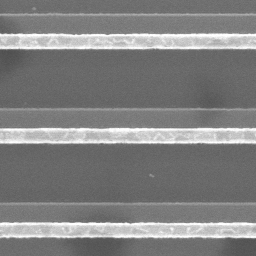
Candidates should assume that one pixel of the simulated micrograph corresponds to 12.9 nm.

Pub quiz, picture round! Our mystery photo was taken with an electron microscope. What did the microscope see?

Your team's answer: lines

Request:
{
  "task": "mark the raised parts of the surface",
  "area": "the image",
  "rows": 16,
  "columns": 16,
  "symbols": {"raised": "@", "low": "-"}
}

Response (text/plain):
----------------
@@@@@@@@@@@@@@@@
@@@@@@@@@@@@@@@@
----------------
----------------
----------------
----------------
@@@@@@@@@@@@@@@@
@@@@@@@@@@@@@@@@
----------------
----------------
----------------
----------------
@@@@@@@@@@@@@@@@
@@@@@@@@@@@@@@@@
----------------